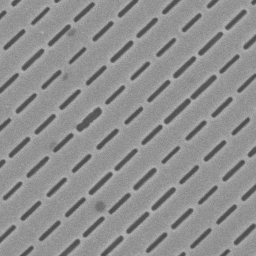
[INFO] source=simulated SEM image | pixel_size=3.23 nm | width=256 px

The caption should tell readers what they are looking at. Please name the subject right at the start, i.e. a regular array of holes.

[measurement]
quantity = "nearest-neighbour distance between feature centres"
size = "87.5 nm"